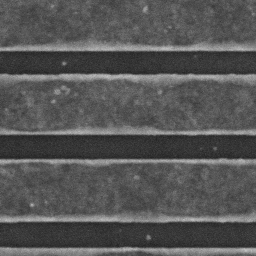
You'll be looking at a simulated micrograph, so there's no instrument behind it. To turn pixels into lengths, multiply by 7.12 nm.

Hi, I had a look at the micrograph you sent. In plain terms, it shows lines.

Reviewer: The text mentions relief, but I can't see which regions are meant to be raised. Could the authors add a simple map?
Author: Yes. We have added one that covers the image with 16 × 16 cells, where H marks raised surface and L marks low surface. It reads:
HHHHHHHHHHHHHHHH
HHHHHHHHHHHHHHHH
HHHHHHHHHHHHHHHH
LLLLLLLLLLLLLLLL
LLLLLLLLLLLLLLLL
HHHHHHHHHHHHHHHH
HHHHHHHHHHHHHHHH
HHHHHHHHHHHHHHHH
LLLLLLLLLLLLLLLL
LLLLLLLLLLLLLLLL
HHHHHHHHHHHHHHHH
HHHHHHHHHHHHHHHH
HHHHHHHHHHHHHHHH
HHHHHHHHHHHHHHHH
LLLLLLLLLLLLLLLL
LLLLLLLLLLLLLLLL